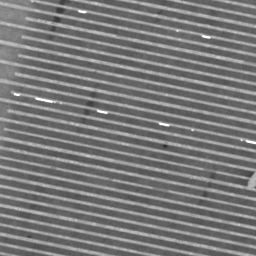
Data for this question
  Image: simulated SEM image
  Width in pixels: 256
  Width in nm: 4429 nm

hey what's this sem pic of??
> parallel lines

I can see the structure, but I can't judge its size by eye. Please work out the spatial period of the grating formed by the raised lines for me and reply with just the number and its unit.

163 nm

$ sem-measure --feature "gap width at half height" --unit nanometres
127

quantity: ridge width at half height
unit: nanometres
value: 46.7